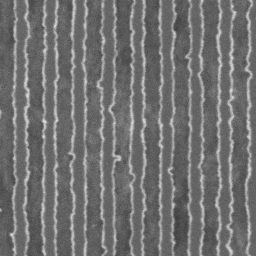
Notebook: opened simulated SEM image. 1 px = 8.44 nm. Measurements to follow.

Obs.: parallel lines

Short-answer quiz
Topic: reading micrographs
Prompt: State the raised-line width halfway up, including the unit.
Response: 111 nanometers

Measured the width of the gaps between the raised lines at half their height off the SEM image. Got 0.139 um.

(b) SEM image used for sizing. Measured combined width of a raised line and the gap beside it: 246 nm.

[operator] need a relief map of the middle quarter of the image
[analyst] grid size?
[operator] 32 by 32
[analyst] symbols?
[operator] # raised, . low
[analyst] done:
..###.....###....###....####...#
..###.....###....###....####...#
..###....####....###....###.....
..###....####....###....###....#
..###....###.....###.....##....#
..###....###.....###....###....#
..###....####....###....###....#
..###....####....###....###....#
..####...###.....###....###....#
..####...###.....###....###....#
..###.....##.....###....####...#
..####....#......###....####...#
..###.....##.....###....####...#
..###.....###....###....###.....
..####....###....###....###....#
..###.....###....###....###....#
..###....####....###....####....
..###....####....###....###....#
..###.....###....###....###....#
..###.....###....###....###....#
..###.....###....###....###....#
..###....####....###....###....#
.#####...####....###....###....#
..###.....####...###....###....#
..###....####...####....###....#
.####....###.....###....###....#
..###....###.....###....###....#
..###....###.....###....###....#
..###....###......##....###....#
..###....###.....###....###....#
..###....####....##.....###....#
..###....###.....###....###....#